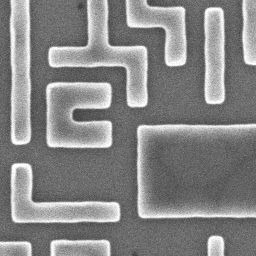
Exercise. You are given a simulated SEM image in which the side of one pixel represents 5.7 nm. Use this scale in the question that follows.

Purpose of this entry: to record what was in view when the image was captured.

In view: wiring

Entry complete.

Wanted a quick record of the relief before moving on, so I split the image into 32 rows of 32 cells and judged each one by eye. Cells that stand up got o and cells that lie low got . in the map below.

.oo........oo...oo............oo
.ooo.......oo...ooooooo...oo..oo
.ooo.......oo...ooooooo...oo..oo
.ooo.......oo.......ooo...oo..oo
.ooo.......oo........oo...oo..oo
.ooo.......ooo.......oo...oo..oo
.ooo..oooooooooooo...oo...oo..oo
.ooo..oooooooooooo...oo...oo...o
.ooo............oo........oo....
..oo............oo........oo....
..oo..ooooooo...oo........oo....
.ooo..oooooooo..oo........oo....
.ooo..oooooooo..oo........oo....
.ooo..ooooooo...................
.ooo..ooo.......................
.ooo..oooooooo..................
.ooo..oooooooo...ooooooooooooooo
..oo..oooooooo...ooooooooooooooo
.................ooooooooooooooo
.................ooooooooooooooo
..o..............ooooooooooooooo
.ooo.............ooooooooooooooo
.ooo.............ooooooooooooooo
.ooo.............ooooooooooooooo
.ooo.............ooooooooooooooo
.oooooooooooooo..ooooooooooooooo
..ooooooooooooo..ooooooooooooooo
..ooooooooooooo.................
................................
................................
oooo..oooooooo............oo....
oooo..oooooooo............oo....